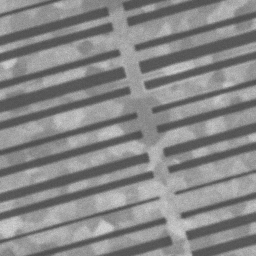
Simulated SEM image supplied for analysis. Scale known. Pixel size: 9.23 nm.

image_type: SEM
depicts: groups of lines, slits or small figures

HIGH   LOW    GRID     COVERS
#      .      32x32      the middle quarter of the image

.....#########.####........#####
..########.....####.....######..
#######.........###..#####......
###.............######..........
.............#######.........###
.........###########......######
.....#######.....###..##########
.########........###############
#####.........################..
##........#################.....
......################........##
..####################....######
################..####.#########
############......############..
########.......###########......
#####.......###########........#
##.......##############....#####
.....##########.....############
.###########........############
########.........#############..
#####........#############......
#........################.......
......############...####.....##
..#############......###########
############..........#######...
########..........########......
####...........###########.....#
#..........########...##########
.......########........#########
....#######.........############
.#######........################
####.........################...